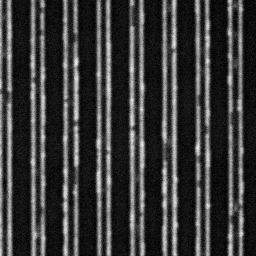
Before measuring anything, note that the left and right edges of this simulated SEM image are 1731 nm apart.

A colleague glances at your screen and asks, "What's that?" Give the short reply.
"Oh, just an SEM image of parallel lines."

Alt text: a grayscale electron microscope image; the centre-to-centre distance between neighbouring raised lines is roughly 223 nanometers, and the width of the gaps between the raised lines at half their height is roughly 140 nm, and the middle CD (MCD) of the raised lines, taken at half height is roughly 86.2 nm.